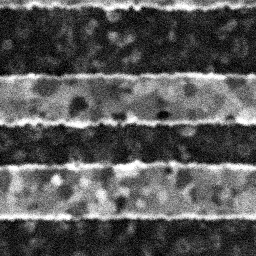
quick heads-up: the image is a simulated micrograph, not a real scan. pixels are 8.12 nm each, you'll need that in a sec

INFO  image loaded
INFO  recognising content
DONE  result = one or a few lines or trenches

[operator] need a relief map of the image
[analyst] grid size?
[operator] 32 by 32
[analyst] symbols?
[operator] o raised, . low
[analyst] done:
oooooooooooooooooooooooooooooooo
................................
................................
................................
..............o.................
................................
................................
................................
................................
.....o..ooooo.oo..ooooooo.o.oo..
oooooooooooooooooooooooooooooooo
oooooooooooooooooooooooooooooooo
oooooooooooooooooooooooooooooooo
oooooooooooooooooooooooooooooooo
oooooooooooooooooooooooooooooooo
oo......ooo.....................
.......................o........
................................
................................
................................
.................o.o.o..........
oooooooooooooooooooooooooooooooo
oooooooooooooooooooooooooooooooo
oooooooooooooooooooooooooooooooo
oooooooooooooooooooooooooooooooo
oooooooooooooooooooooooooooooooo
oooooooooooooooooooooooooooooooo
................................
................................
................................
................................
................................